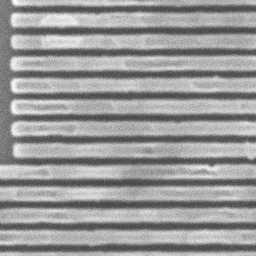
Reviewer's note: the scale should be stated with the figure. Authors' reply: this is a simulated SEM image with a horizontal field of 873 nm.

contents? parallel lines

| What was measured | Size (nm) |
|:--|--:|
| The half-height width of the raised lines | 46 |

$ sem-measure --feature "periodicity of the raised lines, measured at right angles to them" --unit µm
0.0739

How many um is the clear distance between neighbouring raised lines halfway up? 0.029